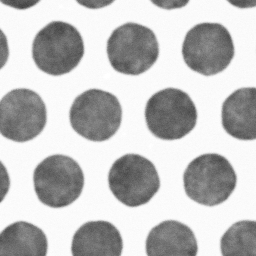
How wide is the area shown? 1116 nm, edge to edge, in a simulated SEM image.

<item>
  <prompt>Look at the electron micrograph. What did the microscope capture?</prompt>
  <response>a regular array of holes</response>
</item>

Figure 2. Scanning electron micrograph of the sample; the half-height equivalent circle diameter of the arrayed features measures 0.232 micrometres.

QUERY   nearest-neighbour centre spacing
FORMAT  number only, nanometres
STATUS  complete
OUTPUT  326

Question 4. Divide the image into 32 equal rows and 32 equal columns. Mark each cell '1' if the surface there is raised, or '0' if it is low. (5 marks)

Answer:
00000111110000111110000111111000
11111111111111111111111111111111
11111111111111111111111111111111
11111000011111100001111100001111
01110000001111000001111000000111
01110000000110000000111000000111
01110000000110000000111000000111
01110000001111000000111000000111
11111000011111000001111100001111
11111111111111111111111111011111
11111111111111111111111111111111
10001111110000111111000111111000
00000111100000011110000011110000
00000011100000011100000001110000
00000011100000011100000001110000
00000011100000011100000001110000
00000111110000011110000011110000
10001111111001111111101111111100
11111111111111111111111111111111
11111100011111100011111110001111
11111000001111000001111100000111
01110000001111000000111000000111
01110000000110000000111000000011
01110000001111000000111000000111
01111000001111000001111000000111
11111000011111100011111110011111
11111111111111111111111111111111
11111111111101111111101111111110
10000111110000011110000011111000
00000011100000011100000011110000
00000011100000011100000001110000
00000011100000011100000001110000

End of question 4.